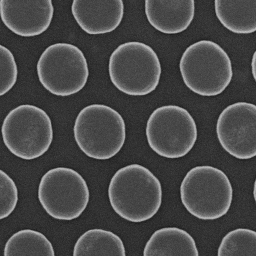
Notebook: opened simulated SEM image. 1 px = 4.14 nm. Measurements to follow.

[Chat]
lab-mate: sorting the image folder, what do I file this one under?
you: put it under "a regular array of raised bodies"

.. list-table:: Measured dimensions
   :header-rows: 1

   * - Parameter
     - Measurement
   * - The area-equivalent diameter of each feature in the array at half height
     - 0.215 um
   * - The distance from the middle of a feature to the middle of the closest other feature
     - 296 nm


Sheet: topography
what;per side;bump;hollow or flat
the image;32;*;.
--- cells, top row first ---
******...******...******...*****
*******..******...******...*****
******....*****....*****....****
.*****....****......***.....****
................................
................**......***.....
*.....****....*****....*****....
**...******...******...******...
**...******...******...******...
**...******...******...******...
**...******...******...*****....
*.....***.......***.....****....
................................
..***......***......***.....****
.*****....*****....*****....****
******...*******..******...*****
*******..*******..******...*****
.*****....******...*****...*****
.*****....*****....*****....****
..***......***.......*.......***
................................
......***......****.....****....
*....*****....******...******...
**...******...******...******...
**...******...******...******...
**...******...******...******...
*.....****.....****.....****....
................**..............
................................
..***.....*****....*****....****
.*****....*****...******....****
.******..*******..*******..*****